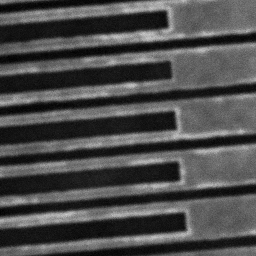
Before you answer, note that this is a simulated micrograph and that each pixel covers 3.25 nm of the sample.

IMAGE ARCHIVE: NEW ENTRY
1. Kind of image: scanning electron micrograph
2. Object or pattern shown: parallel lines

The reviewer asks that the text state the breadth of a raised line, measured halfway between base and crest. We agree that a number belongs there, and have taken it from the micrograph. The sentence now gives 9.48 px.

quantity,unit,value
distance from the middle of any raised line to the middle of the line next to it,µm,0.0838